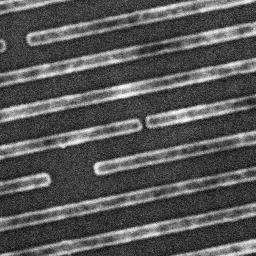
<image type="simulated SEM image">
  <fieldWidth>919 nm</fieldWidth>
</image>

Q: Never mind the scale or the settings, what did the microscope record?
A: parallel lines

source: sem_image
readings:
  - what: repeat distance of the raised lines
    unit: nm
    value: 126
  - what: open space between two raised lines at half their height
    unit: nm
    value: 90.1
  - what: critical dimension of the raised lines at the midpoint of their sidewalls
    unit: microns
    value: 0.0365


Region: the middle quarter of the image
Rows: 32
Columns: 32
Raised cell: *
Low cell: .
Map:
********........................
***.............................
..............................**
.........................*******
....................************
...............************.....
..........*************.........
.....************...............
*************...................
********........................
***.............................
...............................*
..........................******
.....................***********
................***..******.....
...........********..**.........
......************..............
*************...................
********........................
***.............................
...............................*
..........................******
.....................***********
................************....
...........*************........
........**********..............
........*****...................
................................
................................
...............................*
..........................******
.....................***********